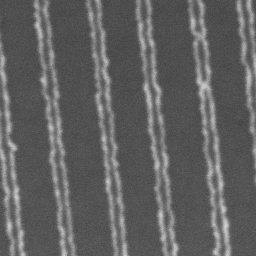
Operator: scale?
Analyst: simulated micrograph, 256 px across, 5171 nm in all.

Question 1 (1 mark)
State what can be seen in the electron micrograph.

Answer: parallel lines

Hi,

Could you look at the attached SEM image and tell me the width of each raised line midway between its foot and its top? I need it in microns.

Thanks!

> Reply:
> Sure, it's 0.216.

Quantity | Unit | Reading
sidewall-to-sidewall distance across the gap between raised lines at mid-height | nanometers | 818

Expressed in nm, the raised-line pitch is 1030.